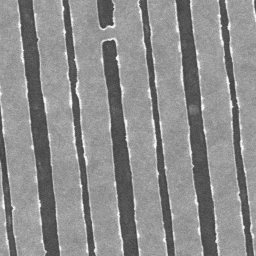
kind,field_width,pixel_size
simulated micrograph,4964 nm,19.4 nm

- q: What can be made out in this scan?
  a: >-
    parallel lines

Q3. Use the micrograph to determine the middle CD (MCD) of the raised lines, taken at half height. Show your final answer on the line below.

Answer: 550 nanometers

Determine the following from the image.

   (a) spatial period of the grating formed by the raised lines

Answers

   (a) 769 nanometres